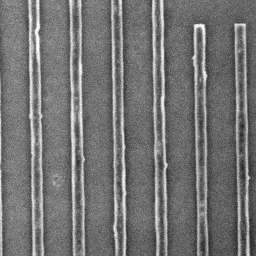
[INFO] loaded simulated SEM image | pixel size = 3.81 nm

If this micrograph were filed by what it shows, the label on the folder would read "parallel lines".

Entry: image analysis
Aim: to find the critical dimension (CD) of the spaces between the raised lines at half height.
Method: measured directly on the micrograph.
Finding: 30.4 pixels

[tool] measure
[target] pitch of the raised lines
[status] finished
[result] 157 nanometers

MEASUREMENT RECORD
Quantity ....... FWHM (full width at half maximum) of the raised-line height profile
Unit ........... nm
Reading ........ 40.5